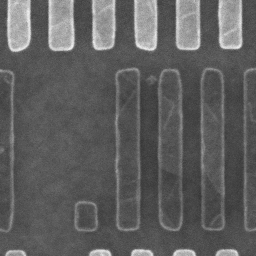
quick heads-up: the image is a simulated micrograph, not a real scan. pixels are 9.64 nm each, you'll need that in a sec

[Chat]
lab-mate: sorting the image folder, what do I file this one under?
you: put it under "wiring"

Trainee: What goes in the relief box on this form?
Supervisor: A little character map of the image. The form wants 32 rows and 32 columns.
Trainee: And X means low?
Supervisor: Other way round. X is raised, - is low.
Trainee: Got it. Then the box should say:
-XXX--XXX---XX---XXX--XXX--XXX--
-XXX--XXX---XX---XXX--XXX--XXX--
-XXX--XXX---XX---XXX--XXX--XXX--
-XXX--XXX---XX---XXX--XXX--XXX--
-XXX--XXX---XX---XXX--XXX--XXX--
-XXX--XXX---XX---XXX--XXX---XX--
--------------------------------
--------------------------------
--------------------------------
XX-------------XX---XX---XXX---X
XX-------------XX---XXX--XXX---X
XX-------------XX---XXX--XXX---X
X--------------XX---XXX--XXX---X
XX-------------XX---XXX--XXX---X
XX-------------XX---XXX--XXX---X
XX------------XXX---XXX--XXX---X
XX-------------XX---XXX--XXX---X
XX-------------XX---XXX--XXX---X
XX-------------XX---XXX--XXX---X
XX-------------XX---XXX--XXX---X
XX-------------XX---XXX--XXX---X
XX-------------XX---XXX--XXX---X
XX-------------XX---XXX--XXX---X
XX-------------XX---XXX--XXX---X
XX-------------XX---XXX--XXX---X
XX--------XX---XX---XXX--XXX---X
XX-------XXX---XX---XXX--XXX---X
X--------XXX---XX---XXX--XXX---X
X---------XX---XX----X----XX---X
--------------------------------
--------------------------------
-XX---------X----XX---XX---XX---